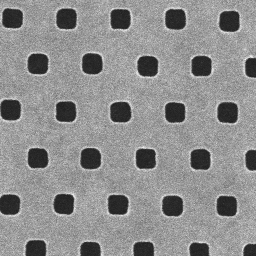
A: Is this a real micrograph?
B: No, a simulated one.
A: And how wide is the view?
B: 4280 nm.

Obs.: a regular array of holes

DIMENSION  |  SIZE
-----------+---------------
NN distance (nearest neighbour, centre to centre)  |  883 nanometres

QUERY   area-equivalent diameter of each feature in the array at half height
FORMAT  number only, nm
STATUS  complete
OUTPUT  376